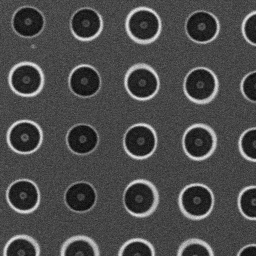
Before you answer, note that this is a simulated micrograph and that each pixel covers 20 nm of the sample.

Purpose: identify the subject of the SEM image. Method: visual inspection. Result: an array of small figures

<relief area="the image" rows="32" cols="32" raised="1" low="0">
11111111111111111111111111111111
11000111110011111001111111111111
11000111100001110000111000011110
11000111100001110000111000011100
11101111110011110001111100011110
11111111111111111111111111111111
11111111111111111111111111111111
11111111111111111111111111111111
11000111110011111001111111111111
10000111100011110001111000011110
10000111100011110000111000011100
11000111100011110001111000011100
11111111111111111111111100111110
11111111111111111111111111111111
11111111111111111111111111111111
11001111111111111111111111111111
10000111100011110001111000111110
10000111000011110001111000011100
11000111100011110001111000011100
11111111111111111011111100111110
11111111111111111111111111111111
11111111111111111111111111111111
11111111111111111111111111111111
10000111100011110001111000111110
10000111000011110001111000111100
10000111000011110001111000011100
11111111111111110001111000111100
11111111111111111111111111111111
11111111111111111111111111111111
11111111111111111111111111111111
10001111000011110011111001111111
10000111000011100001111000111100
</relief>